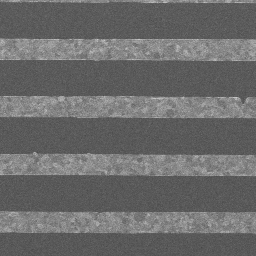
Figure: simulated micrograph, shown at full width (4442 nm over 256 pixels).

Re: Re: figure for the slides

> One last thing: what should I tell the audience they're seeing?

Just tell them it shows parallel lines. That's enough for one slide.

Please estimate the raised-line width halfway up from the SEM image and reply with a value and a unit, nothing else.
358 nanometers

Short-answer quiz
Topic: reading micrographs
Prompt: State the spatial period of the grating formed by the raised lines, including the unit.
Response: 0.999 microns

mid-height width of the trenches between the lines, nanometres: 646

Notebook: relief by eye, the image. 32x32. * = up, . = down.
................................
................................
................................
................................
................................
********************************
********************************
...........**...........**.*.***
................................
................................
................................
................................
****.****************.********.*
****.***************************
***..***************************
................................
................................
................................
................................
********************************
********************************
********************************
................................
................................
................................
................................
................................
********************************
********************************
................................
................................
................................